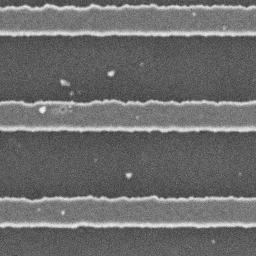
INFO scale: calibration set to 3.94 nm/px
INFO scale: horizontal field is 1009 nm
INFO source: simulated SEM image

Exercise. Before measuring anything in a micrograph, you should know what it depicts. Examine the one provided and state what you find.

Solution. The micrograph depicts lines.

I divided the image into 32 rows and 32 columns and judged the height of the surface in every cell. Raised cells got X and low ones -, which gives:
--------------------------------
XXXXXXXXXXXXXXXXXXXXXXXXXXXXXXXX
XXXXXXXXXXXXXXXXXXXXXXXXXXXXXXXX
XXXXXXXXXXXXXXXXXXXXXXXXXXXXXXXX
--------------------------------
--------------------------------
--------------------------------
--------------------------------
--------------------------------
--------------------------------
--------------------------------
--------------------------------
--------------------------------
XXXXXXXXXXXXXXXXXXXXXXXXXXXXXXXX
XXXXXXXXXXXXXXXXXXXXXXXXXXXXXXXX
XXXXXXXXXXXXXXXXXXXXXXXXXXXXXXXX
--------------------------------
--------------------------------
--------------------------------
--------------------------------
--------------------------------
--------------------------------
--------------------------------
--------------------------------
--------------------------------
XXXXXXXXXXXXXXXXXXXXXXXXXXXXXXXX
XXXXXXXXXXXXXXXXXXXXXXXXXXXXXXXX
XXXXXXXXXXXXXXXXXXXXXXXXXXXXXXXX
--------------------------------
--------------------------------
--------------------------------
--------------------------------